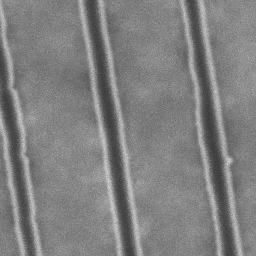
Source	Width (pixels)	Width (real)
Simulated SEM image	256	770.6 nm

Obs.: one or a few lines or trenches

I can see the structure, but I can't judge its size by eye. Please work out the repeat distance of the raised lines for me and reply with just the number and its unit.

298 nanometers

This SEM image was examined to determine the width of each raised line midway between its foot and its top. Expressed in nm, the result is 60.9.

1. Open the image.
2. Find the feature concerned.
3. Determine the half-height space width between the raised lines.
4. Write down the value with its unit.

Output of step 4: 236 nm